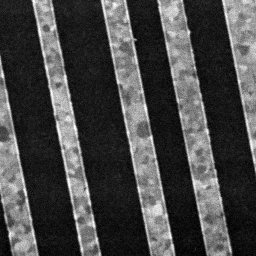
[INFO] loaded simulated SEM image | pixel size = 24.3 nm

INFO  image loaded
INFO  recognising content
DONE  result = one or a few lines or trenches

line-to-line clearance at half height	1060	nm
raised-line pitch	1540	nm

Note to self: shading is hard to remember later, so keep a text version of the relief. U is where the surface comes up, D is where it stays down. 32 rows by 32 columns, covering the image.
DDDDUUDDDDDDDUUUDDDDUUUDDDDDUUUU
DDDDUUUDDDDDDUUUDDDDUUUDDDDDUUUU
DDDDDUUDDDDDDUUUDDDDUUUDDDDDUUUU
DDDDDUUDDDDDDUUUDDDDUUUDDDDDDUUU
DDDDDUUDDDDDDDUUUDDDDUUUDDDDDUUU
DDDDDUUDDDDDDDUUUDDDDUUUDDDDDUUU
DDDDDUUUDDDDDDUUUDDDDUUUDDDDDUUU
DDDDDDUUDDDDDDUUUDDDDUUUDDDDDUUU
DDDDDDUUDDDDDDUUUDDDDUUUDDDDDDUU
DDDDDDUUDDDDDDDUUDDDDDUUUDDDDDUU
UDDDDDUUDDDDDDDUUUDDDDUUUDDDDDUU
UDDDDDUUDDDDDDDUUUDDDDUUUDDDDDUU
UDDDDDDUUDDDDDDUUUDDDDUUUDDDDDUU
UDDDDDDUUDDDDDDUUUDDDDUUUDDDDDUU
UDDDDDDUUDDDDDDDUUDDDDDUUUDDDDDU
UUDDDDDUUDDDDDDDUUUDDDDUUUDDDDDU
UUDDDDDUUUDDDDDDUUUDDDDUUUDDDDDU
UUDDDDDDUUDDDDDDUUUDDDDUUUDDDDDU
UUDDDDDDUUDDDDDDUUUDDDDUUUDDDDDU
UUDDDDDDUUDDDDDDDUUDDDDDUUDDDDDD
UUDDDDDDUUDDDDDDDUUUDDDDUUUDDDDD
UUUDDDDDUUDDDDDDDUUUDDDDUUUDDDDD
UUUDDDDDDUUDDDDDDUUUDDDDUUUDDDDD
UUUDDDDDDUUDDDDDDUUUDDDDUUUDDDDD
UUUDDDDDDUUDDDDDDUUUDDDDDUUUDDDD
UUUDDDDDDUUDDDDDDDUUUDDDDUUUDDDD
DUUUDDDDDUUDDDDDDDUUUDDDDUUUDDDD
DUUUDDDDDDUUDDDDDDUUUDDDDUUUDDDD
DUUUDDDDDDUUDDDDDDUUUDDDDUUUDDDD
DUUUDDDDDDUUDDDDDDUUUDDDDDUUUDDD
DUUUDDDDDDUUDDDDDDDUUUDDDDUUUDDD
DDUUUDDDDDUUDDDDDDDUUUDDDDUUUDDD